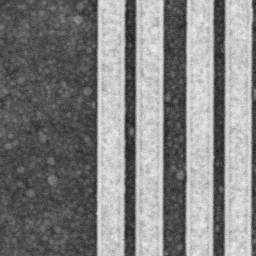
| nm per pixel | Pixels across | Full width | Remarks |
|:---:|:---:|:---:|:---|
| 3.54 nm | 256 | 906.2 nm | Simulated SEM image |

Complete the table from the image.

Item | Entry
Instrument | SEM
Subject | parallel lines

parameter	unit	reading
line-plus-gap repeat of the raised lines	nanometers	150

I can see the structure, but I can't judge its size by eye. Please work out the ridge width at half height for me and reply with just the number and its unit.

82.4 nm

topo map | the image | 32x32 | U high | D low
DDDDDDDDDDDDDUUDDUUUDDDDUUDDUUUD
DDDDDDDDDDDDDUUDDUUUDDDDUUDDUUUD
DDDDDDDDDDDDDUUDDUUUDDDDUUDDUUUD
DDDDDDDDDDDDDUUDDUUUDDDDUUDDUUUD
DDDDDDDDDDDDDUUDDUUUDDDDUUDDUUUD
DDDDDDDDDDDDDUUDDUUUDDDDUUDDUUUD
DDDDDDDDDDDDDUUDDUUUDDDDUUDDUUUD
DDDDDDDDDDDDDUUDDUUUDDDDUUDDUUUD
DDDDDDDDDDDDDUUDDUUUDDDDUUDDUUUD
DDDDDDDDDDDDDUUDDUUUDDDDUUDDUUUD
DDDDDDDDDDDDDUUDDUUUDDDDUUDDUUUD
DDDDDDDDDDDDDUUDDUUUDDDDUUDDUUUD
DDDDDDDDDDDDDUUDDUUUDDDDUUDDUUUD
DDDDDDDDDDDDDUUDDUUUDDDDUUDDUUUD
DDDDDDDDDDDDDUUDDUUUDDDDUUDDUUUD
DDDDDDDDDDDDUUUDDUUUDDDDUUDDUUUD
DDDDDDDDDDDDUUUDDUUUDDDDUUDDUUUD
DDDDDDDDDDDDUUUDDUUUDDDDUUDDUUUD
DDDDDDDDDDDDUUUDDUUUDDDDUUDDUUUD
DDDDDDDDDDDDUUUDDUUUDDDDUUDDUUUD
DDDDDDDDDDDDUUUDDUUUDDDDUUDDUUUD
DDDDDDDDDDDDUUUDDUUUDDDDUUDDUUUD
DDDDDDDDDDDDUUUDDUUUDDDDUUDDUUUD
DDDDDDDDDDDDUUUDDUUUDDDDUUDDUUUD
DDDDDDDDDDDDUUUDDUUUDDDDUUDDUUUD
DDDDDDDDDDDDUUUDDUUUDDDDUUDDUUUD
DDDDDDDDDDDDUUUDDUUUDDDUUUDDUUUD
DDDDDDDDDDDDUUUDDUUUDDDUUUDDUUUD
DDDDDDDDDDDDUUUDDUUUDDDUUUDDUUUD
DDDDDDDDDDDDUUUDDUUUDDDUUUDDUUUD
DDDDDDDDDDDDUUUDDUUUDDDUUUDDUUUD
DDDDDDDDDDDDUUUDDUUUDDDUUUDDUUUD